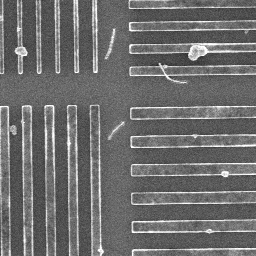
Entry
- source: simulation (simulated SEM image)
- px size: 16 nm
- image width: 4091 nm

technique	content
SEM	groups of lines, slits or small figures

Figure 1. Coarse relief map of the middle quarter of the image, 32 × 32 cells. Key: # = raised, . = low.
.......#................##......
.......#.........###############
.................###############
................................
................................
................................
................................
................................
................................
................................
.##....##.......................
.##....##........###############
.##....##........###############
.##....##........###############
.##....##.......................
.##....##.......................
.##....##.......................
.##....##.......................
.##....##........###############
.##....##........###############
.##....##........###############
.##....##.......................
.##....##.......................
.##....##.......................
.##....##.......................
.##....##........###############
.##....##........###############
.##....##........###############
.##....##.......................
.##....##.......................
.##....##.......................
.##....##.......................